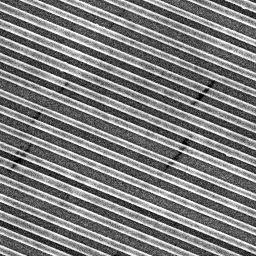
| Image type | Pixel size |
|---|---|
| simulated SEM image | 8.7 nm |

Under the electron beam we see parallel lines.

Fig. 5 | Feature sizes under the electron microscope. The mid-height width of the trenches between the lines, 71.3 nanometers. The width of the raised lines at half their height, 63.4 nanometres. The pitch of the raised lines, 139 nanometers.